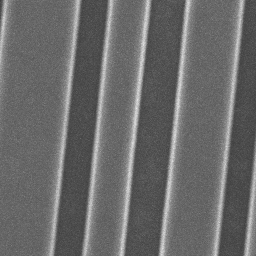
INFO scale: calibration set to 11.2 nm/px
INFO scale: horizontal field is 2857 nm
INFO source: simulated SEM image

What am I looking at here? one or a few lines or trenches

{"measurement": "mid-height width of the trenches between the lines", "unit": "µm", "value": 0.351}